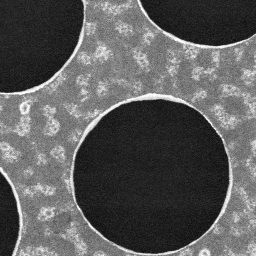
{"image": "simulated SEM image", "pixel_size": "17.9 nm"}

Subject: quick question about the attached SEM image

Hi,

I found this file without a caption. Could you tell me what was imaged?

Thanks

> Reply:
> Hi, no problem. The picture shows holes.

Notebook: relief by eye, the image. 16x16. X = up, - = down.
-----XXXX-------
-----XXXXX------
-----XXXXXX----X
----XXXXXXXXXXXX
----XXXXXXXXXXXX
--XXXXXXXXXXXXXX
XXXXXXXX----XXXX
XXXXXX-------XXX
XXXXX---------XX
XXXXX---------XX
XXXXX---------XX
-XXX----------XX
-XXXX---------XX
-XXXX---------XX
-XXXXX-------XXX
-XXXXXXX---XXXXX